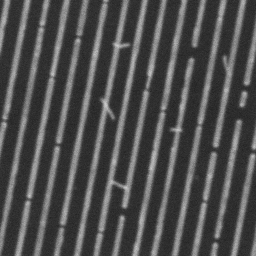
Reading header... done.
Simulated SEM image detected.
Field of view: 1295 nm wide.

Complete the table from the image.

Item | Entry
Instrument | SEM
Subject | parallel lines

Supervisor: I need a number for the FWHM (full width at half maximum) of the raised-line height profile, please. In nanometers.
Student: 16.2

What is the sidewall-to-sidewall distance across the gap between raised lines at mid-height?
80.2 nanometres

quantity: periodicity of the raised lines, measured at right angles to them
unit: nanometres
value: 97.5